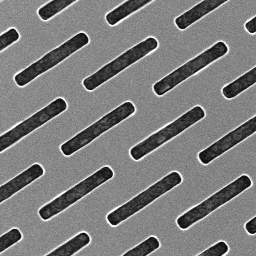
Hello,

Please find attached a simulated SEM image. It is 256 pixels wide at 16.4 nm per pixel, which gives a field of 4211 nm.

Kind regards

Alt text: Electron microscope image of a regular array of holes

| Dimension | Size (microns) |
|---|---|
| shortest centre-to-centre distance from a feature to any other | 1.13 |